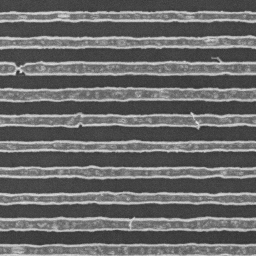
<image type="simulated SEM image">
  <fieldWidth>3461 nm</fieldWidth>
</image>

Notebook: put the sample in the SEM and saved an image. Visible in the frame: parallel lines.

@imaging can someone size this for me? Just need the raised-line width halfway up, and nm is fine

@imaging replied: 130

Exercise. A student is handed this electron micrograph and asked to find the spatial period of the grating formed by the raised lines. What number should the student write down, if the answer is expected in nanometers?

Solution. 351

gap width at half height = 220 nm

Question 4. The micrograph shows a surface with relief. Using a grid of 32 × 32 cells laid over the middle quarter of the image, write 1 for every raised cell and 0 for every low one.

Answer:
11111111111111111111111111111111
11111111111111111111111111111111
00011001100011100000000111111110
00000000000000000000000000000000
00000000000000000000000000000000
00000000000000000000000000000000
11111111111111111111111111111111
11111111111111111111111111111111
11111111111111111111111111111111
00000000000000000000000000000000
00000000000000000000000000000000
00000000000000000000000000000000
00010000000000000000000000000000
11111111111111111111111111111111
11111111111111111111111111111111
11100000000000000000000000001101
00000000000000000000000000000000
00000000000000000000000000000000
00000000000000000000000000000000
11000000000000001111000000000000
11111111111111111111111111111111
11111111111111111111111111111111
00000000000000000000000000000000
00000000000000000000000000000000
00000000000000000000000000000000
00000000000000000000000000000000
11111111111111111111111111111111
11111111111111111111111111111111
00000010011000000000000000000000
00000000000000000000000000000000
00000000000000000000000000000000
00000000000000000000000000000000